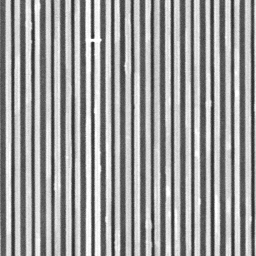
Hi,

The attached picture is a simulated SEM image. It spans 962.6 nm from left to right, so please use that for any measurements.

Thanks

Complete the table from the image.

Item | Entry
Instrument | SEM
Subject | parallel lines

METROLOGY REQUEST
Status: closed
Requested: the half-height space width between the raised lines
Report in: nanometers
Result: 17.4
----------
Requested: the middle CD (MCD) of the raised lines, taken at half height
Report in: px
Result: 4.63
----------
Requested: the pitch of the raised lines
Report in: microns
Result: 0.0376